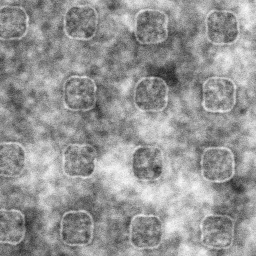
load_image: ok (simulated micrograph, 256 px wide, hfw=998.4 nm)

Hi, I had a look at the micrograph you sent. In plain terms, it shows a regular array of raised bodies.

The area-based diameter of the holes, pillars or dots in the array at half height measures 138 nm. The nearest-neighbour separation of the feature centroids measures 264 nm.